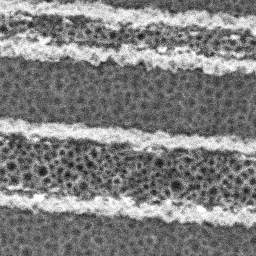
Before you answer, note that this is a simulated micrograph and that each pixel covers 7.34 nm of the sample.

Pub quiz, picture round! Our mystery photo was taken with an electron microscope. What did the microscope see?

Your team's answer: one or a few lines or trenches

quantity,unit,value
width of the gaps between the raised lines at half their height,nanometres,593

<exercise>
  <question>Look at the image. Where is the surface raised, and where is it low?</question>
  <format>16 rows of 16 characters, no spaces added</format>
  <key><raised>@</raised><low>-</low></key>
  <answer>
@@@-------------
@@@@@@@@@@@@@@-@
@@@@@@@@@@@@@@@@
--------@@@@@@@@
----------------
----------------
----------------
----------------
@@@@@@@@--------
@@@@@@@@@@@@@@@@
@@@@@@@@@@@@@@@@
@@@@@@@@@@@@@@@@
-@@@@@@@@@@@@@@@
-------------@@@
----------------
----------------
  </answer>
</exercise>